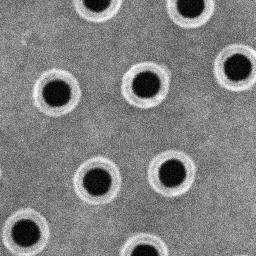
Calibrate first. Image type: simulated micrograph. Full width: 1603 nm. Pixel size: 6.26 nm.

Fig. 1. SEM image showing ring-shaped raised bodies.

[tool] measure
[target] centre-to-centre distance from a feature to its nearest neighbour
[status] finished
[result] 510 nm